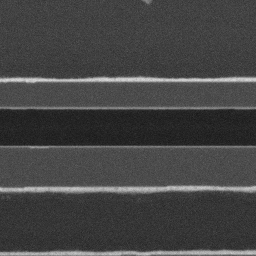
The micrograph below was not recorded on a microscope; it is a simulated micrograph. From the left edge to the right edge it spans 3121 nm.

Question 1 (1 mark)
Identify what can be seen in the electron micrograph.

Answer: lines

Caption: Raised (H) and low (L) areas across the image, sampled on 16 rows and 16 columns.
LLLLLLLLLLLLLLLL
LLLLLLLLLLLLLLLL
LLLLLLLLLLLLLLLL
LLLLLLLLLLLLLLLL
LLLLLLLLLLLLLLLL
HHHHHHHHHHHHHHHH
HHHHHHHHHHHHHHHH
LLLLLLLLLLLLLLLL
LLLLLLLLLLLLLLLL
HHHHHHHHHHHHHHHH
HHHHHHHHHHHHHHHH
HHHHHHHHHHHHHHHH
LLLLLLLLLLLLLLLL
LLLLLLLLLLLLLLLL
LLLLLLLLLLLLLLLL
LLLLLLLLLLLLLLLL